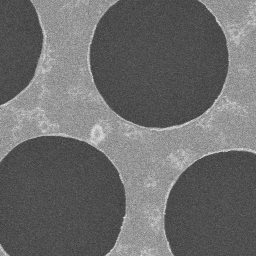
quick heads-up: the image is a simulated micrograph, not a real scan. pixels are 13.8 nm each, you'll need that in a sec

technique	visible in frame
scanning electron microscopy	holes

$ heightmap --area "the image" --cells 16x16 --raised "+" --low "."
..+++++......+++
..++++........++
...+++........++
...+++........++
..++++........++
..++++........++
+++++++......+++
++++++++....++++
++++++++++++++++
+.....++++++++..
.......+++++....
........+++.....
........++......
........++......
.......+++......
.......++++.....